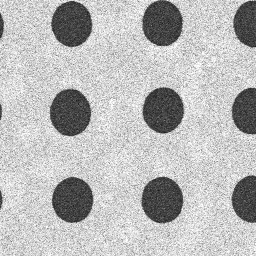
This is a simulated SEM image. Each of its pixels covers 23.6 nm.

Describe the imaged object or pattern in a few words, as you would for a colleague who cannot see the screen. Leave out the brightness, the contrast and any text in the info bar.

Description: holes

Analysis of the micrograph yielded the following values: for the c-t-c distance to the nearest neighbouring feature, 2100 nanometres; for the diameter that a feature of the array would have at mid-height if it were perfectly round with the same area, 1020 nm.